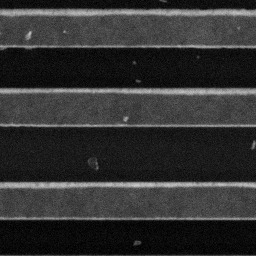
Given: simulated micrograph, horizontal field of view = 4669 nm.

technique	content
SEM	lines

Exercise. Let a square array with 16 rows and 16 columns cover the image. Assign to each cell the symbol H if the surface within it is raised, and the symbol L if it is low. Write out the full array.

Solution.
LLLLLLLLLLLLLLLL
HHHHHHHHHHHHHHHH
HHHHHHHHHHHHHHHH
LLLLLLLLLLLLLLLL
LLLLLLLLLLLLLLLL
LLLLLLLLLLLLLLLL
HHHHHHHHHHHHHHHH
HHHHHHHHHHHHHHHH
LLLLLLLLLLLLLLLL
LLLLLLLLLLLLLLLL
LLLLLLLLLLLLLLLL
HHHHHHHHHHHHHHHH
HHHHHHHHHHHHHHHH
HHHHHHHHHHHHHHHH
LLLLLLLLLLLLLLLL
LLLLLLLLLLLLLLLL